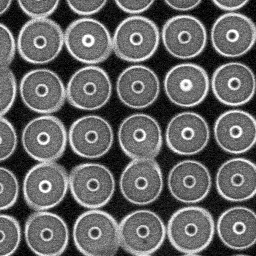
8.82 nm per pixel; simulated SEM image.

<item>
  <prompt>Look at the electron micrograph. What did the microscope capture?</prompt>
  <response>an array of small figures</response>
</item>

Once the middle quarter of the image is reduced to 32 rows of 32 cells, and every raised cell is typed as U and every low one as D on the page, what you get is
UUUUUUUUUUUUUUUUUUUUUUUUUUUUUDDD
UUUUUDDDDUUUUUUUDDDDDUUUUUUDDDDD
UUUDDDDDDDUUUUUDDDDDDDUUUUDDDDDD
UUDDDDDDDDDUUUDDDDDDDDDUUUDDDDDD
UUDDDDDDDDDUUUDDDDUDDDDUUDDDDDUD
UDDDDUUUDDDUUDDDDUUUDDDUUDDDDUUD
UDDDDUUUDDDUUDDDDUUUDDDUUUDDDDDD
UDDDDDUDDDDUUUDDDDDDDDDUUUDDDDDD
UUDDDDDDDDDUUUDDDDDDDDUUUUUDDDDD
UUDDDDDDDDUUUUUDDDDDDDUUUUUUDDDD
UUUUDDDDDUUUUUUUUDDDUUUUUUUUUUUU
UUUUUUUUUUUUUUUUUUUUUUUUUUUUUUUU
UUUUUUUUUUUUUUUUUUUUUUUUUUUUUUDD
UUUUUDDDUUUUUUUUUDDDDUUUUUUUDDDD
UUUDDDDDDDUUUUUDDDDDDDDUUUUDDDDD
UUDDDDDDDDDUUUUDDDDDDDDUUUDDDDDD
UUDDDDDDDDDUUUDDDDUDDDDDUUDDDDUU
UUDDDDUUDDDDUUDDDUUUDDDDUUDDDDUU
UUDDDUUUDDDDUUDDDDUUDDDDUUDDDDUU
UUDDDDUUDDDDUUDDDDDDDDDDUUDDDDDD
UUDDDDDDDDDUUUUDDDDDDDDDUUUDDDDD
UUUDDDDDDDDUUUUDDDDDDDDUUUUUDDDD
UUUUDDDDDUUUUUUUDDDDDDUUUUUUUUUU
UUUUUUUUUUUUUUUUUUUDUUUUUUUUUUUU
UUUUUUUUUUUUUUUUUUDDDUUUUUUUUUUD
UUUUUDDDDUUUUUUUDDDDDDDUUUUUDDDD
UUUDDDDDDDUUUUUUDDDDDDDDUUUDDDDD
UUDDDDDDDDDUUUUDDDDDDDDDUUUDDDDD
UUDDDDDDDDDDUUUDDDDUDDDDUUDDDDUU
DUDDDDUUUDDDUUDDDDUUUDDDUUDDDDUU
DUDDDDUUUDDDUUDDDDUUUDDDUUUDDDUU
UUDDDDDUDDDDUUUDDDDDDDDDUUUDDDDD